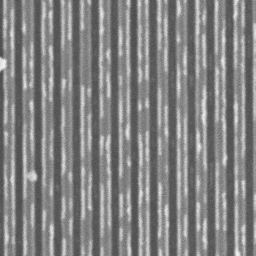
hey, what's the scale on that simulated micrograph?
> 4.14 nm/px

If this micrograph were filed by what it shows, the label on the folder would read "parallel lines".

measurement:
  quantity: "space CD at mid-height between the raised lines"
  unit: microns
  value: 0.0342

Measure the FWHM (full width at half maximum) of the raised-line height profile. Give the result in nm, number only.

45.1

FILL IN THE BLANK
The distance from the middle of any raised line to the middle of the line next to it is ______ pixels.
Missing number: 19.2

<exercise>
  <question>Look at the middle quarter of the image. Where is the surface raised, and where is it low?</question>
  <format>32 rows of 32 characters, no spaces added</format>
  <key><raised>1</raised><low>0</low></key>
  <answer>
11001110011000110001100111001100
11001110011000110001100111001100
11001110011000110001100011001100
11001110011000110001100011001100
11001110011000110001100011001100
11001110011000110001100011001100
11001110011000110001100111001110
11001110011000110001100111001110
11001110011000110001100111001110
11001110011000110001100111001110
11001110011000110001100011001110
11001110011000110001100011001110
11001110011000110001100011001110
11001110011000110001100011000110
11001110011000110001100011000110
11001110011000110001100011001110
11001110011000110001100011001110
11001110011000110001100011001110
11001110011000110001100011000110
11001110011000110001100011000110
11001110011000110001100011001110
11001110011100110001100011001110
11001110011100111001100011000110
11001110011100111001100011000110
11000110011100111001100011001110
11000110011100111001100011001110
11000110011100111001100011001110
11000110011100111001100011001110
11000110011100111001100011001110
11000110011100111001100011001110
11001110011100111001100011001110
11000110011100111001100011001110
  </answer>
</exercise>